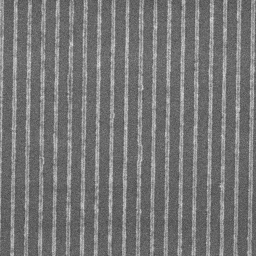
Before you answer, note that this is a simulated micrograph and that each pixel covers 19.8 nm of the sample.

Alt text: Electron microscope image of parallel lines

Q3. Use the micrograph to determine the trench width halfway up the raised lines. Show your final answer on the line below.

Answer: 213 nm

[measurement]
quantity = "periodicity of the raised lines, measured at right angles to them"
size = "277 nm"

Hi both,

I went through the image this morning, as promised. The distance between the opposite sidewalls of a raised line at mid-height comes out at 64.3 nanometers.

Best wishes